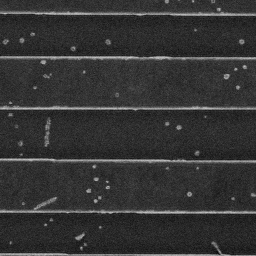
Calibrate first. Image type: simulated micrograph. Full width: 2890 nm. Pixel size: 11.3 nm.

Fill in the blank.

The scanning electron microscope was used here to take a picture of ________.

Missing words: lines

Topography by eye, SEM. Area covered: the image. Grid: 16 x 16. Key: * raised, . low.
****************
................
................
................
****************
****************
****************
................
................
................
****************
****************
****************
................
................
................